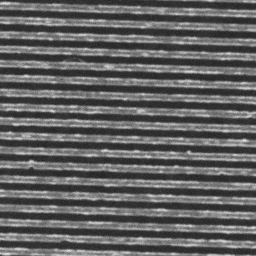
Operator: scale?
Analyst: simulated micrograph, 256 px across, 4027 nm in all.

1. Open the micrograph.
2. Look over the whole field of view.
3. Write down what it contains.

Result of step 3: parallel lines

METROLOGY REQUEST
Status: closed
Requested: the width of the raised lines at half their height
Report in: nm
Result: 100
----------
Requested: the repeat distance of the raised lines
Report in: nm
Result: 227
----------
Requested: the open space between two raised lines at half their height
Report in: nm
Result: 128